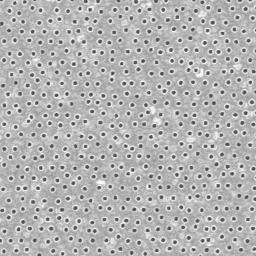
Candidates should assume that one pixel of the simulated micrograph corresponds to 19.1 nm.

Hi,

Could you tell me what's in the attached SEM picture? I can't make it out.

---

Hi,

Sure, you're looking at a regular array of holes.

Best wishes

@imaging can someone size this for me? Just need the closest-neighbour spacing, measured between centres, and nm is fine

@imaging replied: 184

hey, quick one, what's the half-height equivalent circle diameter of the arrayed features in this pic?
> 80.4 nm